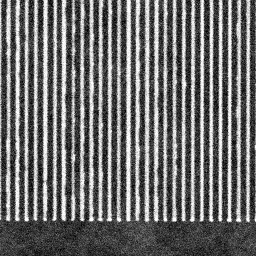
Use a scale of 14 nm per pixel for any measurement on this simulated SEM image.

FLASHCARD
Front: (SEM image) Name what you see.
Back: parallel lines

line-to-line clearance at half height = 103 nanometres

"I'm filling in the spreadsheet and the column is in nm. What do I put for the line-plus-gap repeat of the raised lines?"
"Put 129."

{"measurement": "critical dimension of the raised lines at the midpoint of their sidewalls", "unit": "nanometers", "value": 26.2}